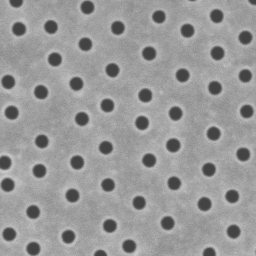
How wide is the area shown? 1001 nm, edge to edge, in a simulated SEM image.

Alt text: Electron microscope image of a regular array of holes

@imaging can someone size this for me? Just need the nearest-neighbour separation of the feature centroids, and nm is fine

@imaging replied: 127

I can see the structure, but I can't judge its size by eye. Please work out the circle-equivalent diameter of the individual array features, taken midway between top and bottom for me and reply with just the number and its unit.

13.4 px